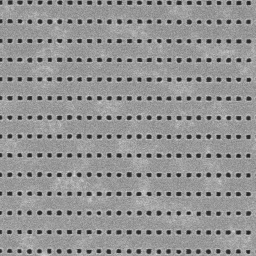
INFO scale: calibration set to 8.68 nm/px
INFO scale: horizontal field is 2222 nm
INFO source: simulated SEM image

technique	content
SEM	a regular array of holes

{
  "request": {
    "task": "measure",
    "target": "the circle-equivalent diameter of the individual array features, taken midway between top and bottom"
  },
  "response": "43.8 nanometres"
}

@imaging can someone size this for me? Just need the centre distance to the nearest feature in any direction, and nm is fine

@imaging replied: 84.3